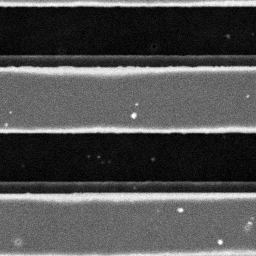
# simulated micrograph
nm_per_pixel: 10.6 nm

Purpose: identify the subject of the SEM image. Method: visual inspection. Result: lines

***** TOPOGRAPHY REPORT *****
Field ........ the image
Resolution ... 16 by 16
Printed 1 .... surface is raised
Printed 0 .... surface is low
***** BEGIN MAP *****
0000000000000000
0000000000000000
0000000000000000
0011111111111111
1111111111111111
1111111111111111
1111111111111111
1111111111111111
0000000000000000
0000000000000000
0000000000000000
1111111111111111
1111111111111111
1111111111111111
1111111111111111
1111111111111111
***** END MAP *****